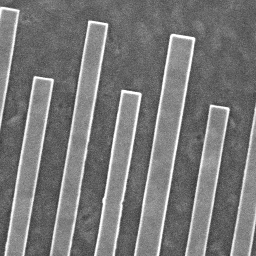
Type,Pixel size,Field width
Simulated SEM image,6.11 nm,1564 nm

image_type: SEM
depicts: parallel lines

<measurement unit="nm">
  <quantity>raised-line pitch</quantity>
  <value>272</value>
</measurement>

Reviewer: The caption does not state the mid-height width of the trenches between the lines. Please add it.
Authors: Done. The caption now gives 159 nm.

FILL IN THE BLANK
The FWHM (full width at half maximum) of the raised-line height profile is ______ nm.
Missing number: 118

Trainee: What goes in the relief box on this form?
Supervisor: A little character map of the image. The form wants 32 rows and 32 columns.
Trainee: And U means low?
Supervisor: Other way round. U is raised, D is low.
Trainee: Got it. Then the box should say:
DDDDDDDDDDDDDDDDDDDDDDDDDDDDDDDD
UUDDDDDDDDDDDDDDDDDDDDDDDDDDDDDD
UUDDDDDDDDDDDDDDDDDDDDDDDDDDDDDD
UUDDDDDDDDDUUDDDDDDDDDDDDDDDDDDD
UUDDDDDDDDDUUDDDDDDDDDDDDDDDDDDD
UUDDDDDDDDDUUDDDDDDDDUUUDDDDDDDD
UUDDDDDDDDUUUDDDDDDDDUUUDDDDDDDD
UDDDDDDDDDUUUDDDDDDDDUUUDDDDDDDD
UDDDDDDDDDUUUDDDDDDDDUUUDDDDDDDD
UDDDDDDDDDUUDDDDDDDDDUUUDDDDDDDD
UDDDUUUDDDUUDDDDDDDDUUUDDDDDDDDD
UDDDUUDDDDUUDDDDDDDDUUUDDDDDDDDD
UDDDUUDDDUUUDDDUUDDDUUUDDDDDDDDD
DDDDUUDDDUUUDDDUUDDDUUUDDDUUDDDD
DDDDUUDDDUUUDDDUUDDDUUUDDDUUDDDD
DDDUUUDDDUUDDDDUUDDDUUDDDDUUDDDD
DDDUUUDDDUUDDDUUUDDUUUDDDDUUDDDU
DDDUUDDDDUUDDDUUUDDUUUDDDDUUDDDU
DDDUUDDDDUUDDDUUDDDUUUDDDUUUDDDU
DDDUUDDDUUUDDDUUDDDUUUDDDUUUDDDU
DDDUUDDDUUUDDDUUDDDUUUDDDUUDDDDU
DDUUUDDDUUDDDDUUDDDUUDDDDUUDDDDU
DDUUUDDDUUDDDDUUDDUUUDDDDUUDDDUU
DDUUDDDDUUDDDUUUDDUUUDDDDUUDDDUU
DDUUDDDDUUDDDUUDDDUUUDDDUUUDDDUU
DDUUDDDUUUDDDUUDDDUUUDDDUUUDDDUU
DDUUDDDUUUDDDUUDDDUUUDDDUUDDDDUU
DUUUDDDUUDDDDUUDDDUUDDDDUUDDDDUU
DUUDDDDUUDDDDUUDDUUUDDDDUUDDDUUU
DUUDDDDUUDDDUUUDDUUUDDDDUUDDDUUU
DUUDDDDUUDDDUUDDDUUUDDDUUUDDDUUD
DUUDDDUUUDDDUUDDDUUUDDDUUUDDDUUD